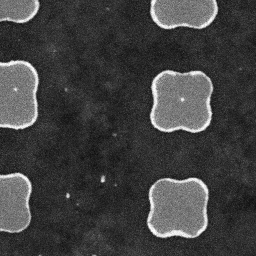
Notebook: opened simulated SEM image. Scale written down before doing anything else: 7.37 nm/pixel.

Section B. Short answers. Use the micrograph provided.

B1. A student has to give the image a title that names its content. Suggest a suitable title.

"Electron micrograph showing raised bodies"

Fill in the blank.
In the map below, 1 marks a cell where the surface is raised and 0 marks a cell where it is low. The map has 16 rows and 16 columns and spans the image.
1100000001111000
0000000000111000
0000000000000000
0000000000000000
1100000000000000
1100000000111000
1100000000111000
1100000001111000
0000000000000000
0000000000000000
0000000000000000
1100000000111000
1100000001111000
1100000001111000
0000000000111000
0000000000000000